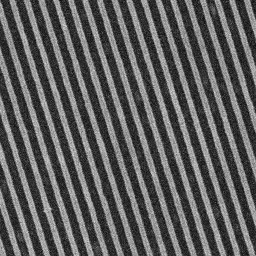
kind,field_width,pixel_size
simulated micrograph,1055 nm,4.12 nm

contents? parallel lines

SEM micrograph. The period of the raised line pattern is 0.0578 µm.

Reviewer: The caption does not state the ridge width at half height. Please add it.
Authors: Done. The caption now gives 0.0197 micrometres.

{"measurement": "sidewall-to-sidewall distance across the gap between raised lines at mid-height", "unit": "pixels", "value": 9.44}